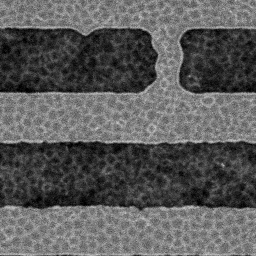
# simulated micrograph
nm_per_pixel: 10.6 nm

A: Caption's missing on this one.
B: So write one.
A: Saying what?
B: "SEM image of one or a few lines or trenches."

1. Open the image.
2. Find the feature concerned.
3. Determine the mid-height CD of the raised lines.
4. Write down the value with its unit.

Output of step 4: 497 nanometers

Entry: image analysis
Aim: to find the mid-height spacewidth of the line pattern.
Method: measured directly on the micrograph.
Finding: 698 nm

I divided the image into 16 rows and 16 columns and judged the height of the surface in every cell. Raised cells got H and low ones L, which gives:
HHHHHHHHHHHHHHHH
HHHHHHHHHHHHHHHH
LLLLLLLLLLHLLLLL
LLLLLLLLLLHLLLLL
LLLLLLLLLLHLLLLL
LLLLLLLLLHHLLLLL
HHHHHHHHHHHHHHHH
HHHHHHHHHHHHHHHH
HHHHHHHHHHHHHHHH
LLLLLLLLLLLLLLLL
LLLLLLLLLLLLLLLL
LLLLLLLLLLLLLLLL
LLLLLLLLLLLLLLLL
HHHHHHHHHHHHHHHH
HHHHHHHHHHHHHHHH
HHHHHHHHHHHHHHHH